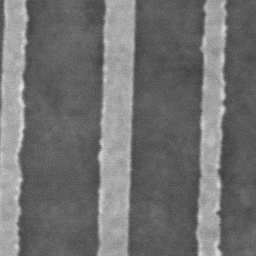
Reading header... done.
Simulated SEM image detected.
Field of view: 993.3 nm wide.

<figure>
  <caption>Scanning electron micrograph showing one or a few lines or trenches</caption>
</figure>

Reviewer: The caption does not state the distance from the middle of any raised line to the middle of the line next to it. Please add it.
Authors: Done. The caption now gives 98.2 px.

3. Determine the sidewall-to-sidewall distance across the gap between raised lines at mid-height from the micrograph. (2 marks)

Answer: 294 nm